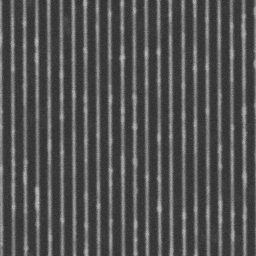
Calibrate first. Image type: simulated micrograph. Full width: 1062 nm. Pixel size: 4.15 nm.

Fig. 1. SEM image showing parallel lines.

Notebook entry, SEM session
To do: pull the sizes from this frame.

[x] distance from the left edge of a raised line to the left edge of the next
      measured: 50.5 nm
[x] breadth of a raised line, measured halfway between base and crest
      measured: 9.3 nm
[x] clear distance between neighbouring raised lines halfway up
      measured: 0.042 microns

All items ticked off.